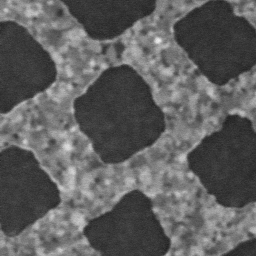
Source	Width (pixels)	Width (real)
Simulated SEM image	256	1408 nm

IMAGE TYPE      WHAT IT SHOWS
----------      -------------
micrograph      holes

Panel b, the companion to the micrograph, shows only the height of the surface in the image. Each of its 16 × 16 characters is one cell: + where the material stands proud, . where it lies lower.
++++......++...+
.++++...+++.....
..++++.++++.....
...+++++++++....
....++...++++..+
...++....+++++++
.++++.....++++++
+++++.....++++..
+++++.....+++...
..++++...+++....
...+++++++++....
....+++++++++...
....+++..++++...
...+++....++++++
.++++.....++++++
++++++.....++++.